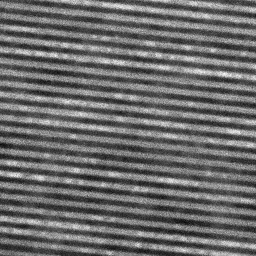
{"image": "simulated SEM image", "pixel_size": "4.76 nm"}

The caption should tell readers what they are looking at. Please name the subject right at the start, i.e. parallel lines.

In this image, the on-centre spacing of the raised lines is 53.3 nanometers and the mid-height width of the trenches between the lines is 0.0331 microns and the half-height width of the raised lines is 0.0207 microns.